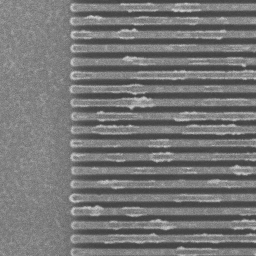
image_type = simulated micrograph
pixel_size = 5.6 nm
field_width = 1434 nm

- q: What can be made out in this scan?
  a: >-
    parallel lines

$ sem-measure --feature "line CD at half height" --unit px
7.75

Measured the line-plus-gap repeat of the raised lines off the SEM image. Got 13.6 pixels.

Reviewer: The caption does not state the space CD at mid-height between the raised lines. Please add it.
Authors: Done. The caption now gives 0.0336 um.